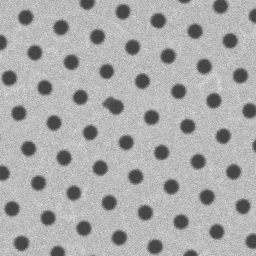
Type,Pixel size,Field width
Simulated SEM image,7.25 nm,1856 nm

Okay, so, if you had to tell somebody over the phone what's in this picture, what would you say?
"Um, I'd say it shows a regular array of holes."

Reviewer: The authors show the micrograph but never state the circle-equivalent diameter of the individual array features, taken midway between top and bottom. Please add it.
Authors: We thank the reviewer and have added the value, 110 nm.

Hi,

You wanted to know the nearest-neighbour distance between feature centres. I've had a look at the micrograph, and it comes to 35.8 pixels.